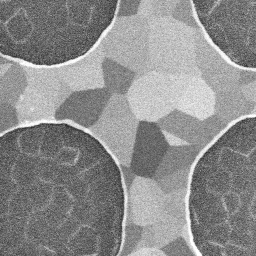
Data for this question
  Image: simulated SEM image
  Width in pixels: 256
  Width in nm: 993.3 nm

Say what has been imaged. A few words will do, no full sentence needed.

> holes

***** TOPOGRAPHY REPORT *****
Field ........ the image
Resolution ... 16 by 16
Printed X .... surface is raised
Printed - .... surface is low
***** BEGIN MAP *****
-------XXXXX----
-------XXXXXX---
------XXXXXXX---
-----XXXXXXXXX--
XXXXXXXXXXXXXXXX
XXXXXXXXXXXXXXXX
XXXXXXXXXXXXXXXX
XXXXXXXXXXXXXXX-
------XXXXXXXX--
-------XXXXXX---
-------XXXXX----
--------XXXX----
--------XXXX----
--------XXXX----
--------XXXX----
--------XXXX----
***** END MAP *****